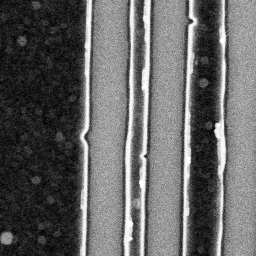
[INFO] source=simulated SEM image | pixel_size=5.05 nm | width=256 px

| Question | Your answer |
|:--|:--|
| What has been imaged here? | one or a few lines or trenches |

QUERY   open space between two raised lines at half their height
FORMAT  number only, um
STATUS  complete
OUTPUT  0.208